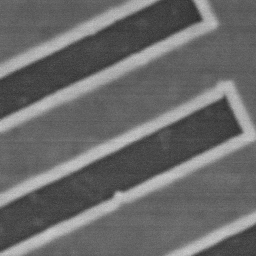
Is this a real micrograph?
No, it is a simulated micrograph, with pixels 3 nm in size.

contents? one or a few lines or trenches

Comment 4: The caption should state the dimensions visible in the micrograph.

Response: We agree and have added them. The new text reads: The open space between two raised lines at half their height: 157 nanometres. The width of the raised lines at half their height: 199 nm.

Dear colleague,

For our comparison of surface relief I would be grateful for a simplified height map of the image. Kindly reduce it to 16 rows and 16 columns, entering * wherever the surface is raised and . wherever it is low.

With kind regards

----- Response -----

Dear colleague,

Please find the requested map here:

********.....***
******.......***
****.......*****
**.......*******
.......*********
.....***********
...*********...*
.*********.....*
********.......*
******........**
****........****
**........******
.......*********
......**********
...***********..
.***********....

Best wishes